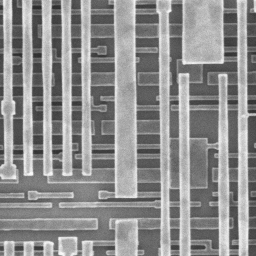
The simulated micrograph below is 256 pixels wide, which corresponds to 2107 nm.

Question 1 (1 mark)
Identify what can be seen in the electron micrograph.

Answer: wiring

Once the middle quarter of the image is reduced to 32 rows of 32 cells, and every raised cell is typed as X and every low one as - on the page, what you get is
XX--XXX------XXXXX------XX------
XX---XX------XXXXX------XX------
XX---XX------XXXXX------XX---XX-
XX---XX------XXXXX------XX---XX-
XX---XX------XXXXX------XX---XX-
XX---X-------XXXXX------XX---XX-
XX---X-------XXXXX------XX---XX-
XX---XX------XXXXX------XX---XX-
XX---XX------XXXXX------XX---XX-
XX---XX------XXXXX------XX---XX-
XX---XX------XXXXX------XX---XX-
XX---XX------XXXXX------XX---XX-
XX---XX------XXXXX------XX---XX-
XX---XX------XXXXX------XX---XX-
XX---XX------XXXXX------XX---XX-
XX---XX------XXXXX------XX---XX-
XX---XX------XXXXX------XX---XX-
XX---XX------XXXXX------XX---XX-
XX---XX------XXXXX------XX---XX-
XX---XX------XXXXX------XX---XX-
XX---XX------XXXXX------XX---XX-
XX---XX------XXXXX------XX---XX-
XX---XX------XXXXX------XX---XX-
XX---XX------XXXXX------XX---XX-
XX---XX------XXXXX------XX---XX-
XX---XX------XXXXX------XX---XX-
XX---XX------XXXXX------XX---XX-
XX---XX------XXXXX------XX---XX-
-------------XXXXX------XX---XX-
-------------XXXXX------XX---XX-
-------------XXXXX------XX---XX-
-------------XXXXX------XX---XX-